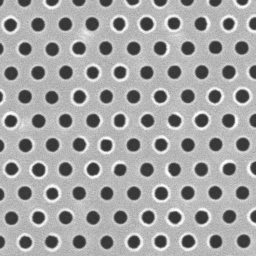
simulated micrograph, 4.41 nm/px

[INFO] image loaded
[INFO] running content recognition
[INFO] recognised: a regular array of holes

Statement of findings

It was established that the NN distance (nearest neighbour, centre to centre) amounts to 119 nm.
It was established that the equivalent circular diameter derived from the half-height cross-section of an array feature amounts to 61.8 nm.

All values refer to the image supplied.